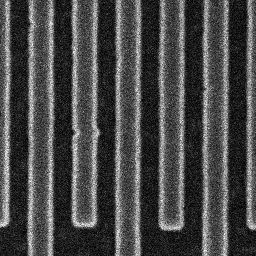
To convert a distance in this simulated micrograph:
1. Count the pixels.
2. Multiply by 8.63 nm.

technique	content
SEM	parallel lines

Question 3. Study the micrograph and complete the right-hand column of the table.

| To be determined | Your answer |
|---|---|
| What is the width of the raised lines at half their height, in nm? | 186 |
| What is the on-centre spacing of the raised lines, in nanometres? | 377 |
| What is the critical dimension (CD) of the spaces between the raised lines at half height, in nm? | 194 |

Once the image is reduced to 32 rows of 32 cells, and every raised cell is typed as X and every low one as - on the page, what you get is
X---XX---XXX---XX---XXX---XX---X
X---XX---XXX---XX---XXX---XX---X
X---XX---XXX---XX---XXX---XX---X
X---XX---XXX---XX---XXX---XX---X
X---XX---XXX---XX---XXX---XX---X
X---XX---XXX---XX---XXX---XX---X
X---XX---XXX---XX---XXX---XX---X
X---XX---XXX---XX---XXX---XX---X
X---XX---XXX---XX---XXX---XX---X
X---XX---XXX---XX---XXX---XX---X
X---XX---XXX---XX---XXX---XX---X
X---XX---XXX---XX---XXX---XX---X
X---XX---XXX---XX---XXX---XX---X
X---XX---XXX---XX---XXX---XX---X
X---XX---XXX---XX---XXX---XX---X
X---XX---XXX---XX---XXX---XX---X
X---XX---XXX---XX---XXX---XX---X
X---XX---XXX---XX---XXX---XX---X
X---XX---XXX---XX---XXX---XX---X
X---XX---XXX---XX---XXX---XX---X
X---XX---XXX---XX---XXX---XX---X
X---XX---XXX---XX---XXX---XX---X
X---XX---XXX---XX---XXX---XX---X
X---XX---XXX---XX---XXX---XX---X
X---XX---XXX---XX---XXX---XX---X
X---XX---XXX---XX---XXX---XX---X
X---XX---XXX---XX---XXX---XX---X
X---XX---XXX---XX---XXX---XX---X
----XX---------XX----X----XX----
----XX---------XX---------XX----
----XX---------XX---------XX----
----XX---------XX---------XX----